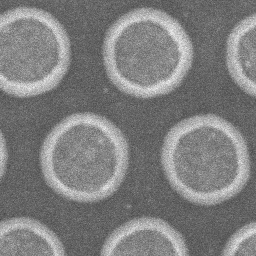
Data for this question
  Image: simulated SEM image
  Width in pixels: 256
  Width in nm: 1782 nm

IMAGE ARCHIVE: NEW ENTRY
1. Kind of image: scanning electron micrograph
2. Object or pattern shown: raised bodies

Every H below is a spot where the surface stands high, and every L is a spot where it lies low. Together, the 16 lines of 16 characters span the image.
LLLLLLLLLLLLLLLL
HHHLLLLHHHHLLLLH
HHHHLLLHHHHHLLLH
HHHHLLLHHHHHLLHH
HHHHLLLHHHHLLLLH
LHHLLLLLHHLLLLLL
LLLLLLLLLLLLLLLL
LLLLHHLLLLLLLLLL
LLLHHHHLLLLHHHHL
LLLHHHHHLLHHHHHL
LLLHHHHHLLHHHHHL
LLLHHHHLLLLHHHHL
LLLLLLLLLLLLLLLL
LLLLLLLLLLLLLLLL
HHHLLLLLHHHLLLLH
HHHHLLLHHHHLLLHH